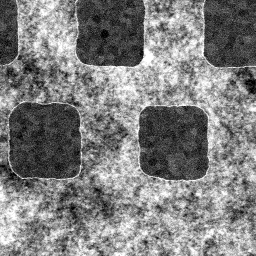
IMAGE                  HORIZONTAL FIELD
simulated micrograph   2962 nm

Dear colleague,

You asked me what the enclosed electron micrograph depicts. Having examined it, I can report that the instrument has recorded raised bodies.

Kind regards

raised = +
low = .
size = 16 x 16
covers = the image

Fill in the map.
+....++++....+++
+....++++....+++
+....++++....+++
+....++++....+++
................
................
.+++............
.++++....++++...
.++++....++++...
.++++....++++...
.++++....++++...
................
................
....+...........
....+...........
................